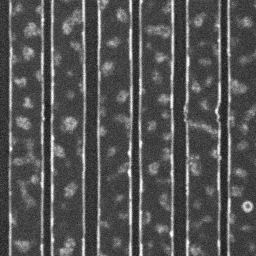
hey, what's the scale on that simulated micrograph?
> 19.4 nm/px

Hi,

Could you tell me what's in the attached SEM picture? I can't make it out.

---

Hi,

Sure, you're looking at parallel lines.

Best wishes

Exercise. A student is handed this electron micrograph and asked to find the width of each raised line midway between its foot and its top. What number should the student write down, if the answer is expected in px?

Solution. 32.8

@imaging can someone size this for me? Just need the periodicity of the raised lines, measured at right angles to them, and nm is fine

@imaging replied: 858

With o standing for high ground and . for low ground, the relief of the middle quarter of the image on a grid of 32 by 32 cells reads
ooooo....oooooooo..oooooooo....o
ooooo....oooooooo..oooooooo....o
ooooo....oooooooo..oooooooo....o
ooooo....oooooooo..oooooooo....o
ooooo....oooooooo..oooooooo....o
ooooo....oooooooo..oooooooo....o
ooooo....oooooooo..oooooooo....o
ooooo....oooooooo..oooooooo....o
ooooo....oooooooo..oooooooo....o
ooooo....oooooooo..oooooooo....o
ooooo....oooooooo..oooooooo...oo
ooooo....oooooooo..oooooooo...oo
ooooo....oooooooo..oooooooo...oo
ooooo....oooooooo..oooooooo...oo
ooooo....oooooooo..oooooooo...oo
ooooo....oooooooo..oooooooo....o
ooooo....oooooooo..oooooooo....o
ooooo....oooooooo..oooooooo....o
ooooo....oooooooo..oooooooo....o
ooooo....oooooooo..oooooooo....o
ooooo....oooooooo..oooooooo....o
ooooo....oooooooo..oooooooo....o
ooooo....oooooooo..oooooooo....o
ooooo....oooooooo..oooooooo....o
ooooo....ooooooo...oooooooo....o
ooooo....ooooooo...oooooooo....o
ooooo....ooooooo...oooooooo....o
ooooo....ooooooo...oooooooo....o
ooooo....oooooooo..oooooooo....o
ooooo....oooooooo..oooooooo....o
ooooo....oooooooo..oooooooo....o
ooooo....oooooooo..oooooooo....o